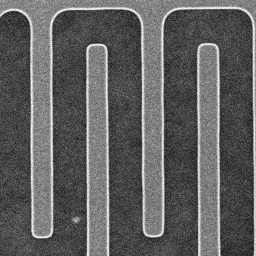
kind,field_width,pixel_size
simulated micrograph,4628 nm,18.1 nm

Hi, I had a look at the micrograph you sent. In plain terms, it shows groups of lines, slits or small figures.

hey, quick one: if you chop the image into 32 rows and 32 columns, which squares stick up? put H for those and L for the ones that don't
HHHHHHHHHHHHHHHHHHHHHHHHHHHHHHHH
HLHHHHHHLLLLLLLLLHHHHLLLLLLLLLLH
LLLLHHHLLLLLLLLLLHHHHLLLLLLLLLLH
LLLLHHLLLLLLLLLLLLHHLLLLLLLLLLLL
LLLLHHLLLLLLLLLLLLHHLLLLLLLLLLLL
LLLLHHLLLLLLLLLLLLHHLLLLLLLLLLLL
LLLLHHLLLLLHHLLLLLHHLLLLLHHLLLLL
LLLLHHLLLLLHHLLLLLHHLLLLLHHLLLLL
LLLLHHLLLLLHHLLLLLHHLLLLLHHLLLLL
LLLLHHLLLLLHHLLLLLHHLLLLLHHLLLLL
LLLLHHLLLLLHHLLLLLHHLLLLLHHLLLLL
LLLLHHLLLLLHHLLLLLHHLLLLLHHLLLLL
LLLLHHLLLLLHHLLLLLHHLLLLLHHLLLLL
LLLLHHLLLLLHHLLLLLHHLLLLLHHLLLLL
LLLLHHLLLLLHHLLLLLHHLLLLLHHLLLLL
LLLLHHLLLLLHHLLLLLHHLLLLLHHLLLLL
LLLLHHLLLLLHHLLLLLHHLLLLLHHLLLLL
LLLLHHLLLLLHHLLLLLHHLLLLLHHLLLLL
LLLLHHHLLLLHHLLLLLHHLLLLLHHLLLLL
LLLLHHHLLLLHHLLLLLHHLLLLLHHLLLLL
LLLLHHHLLLLHHLLLLLHHLLLLLHHLLLLL
LLLLHHHLLLLHHLLLLLHHLLLLLHHLLLLL
LLLLHHHLLLLHHLLLLLHHLLLLLHHLLLLL
LLLLHHHLLLLHHLLLLLHHLLLLLHHLLLLL
LLLLHHHLLLLHHHLLLLHHLLLLLHHLLLLL
LLLLHHHLLLLHHHLLLLHHLLLLLHHLLLLL
LLLLHHHLLLLHHHLLLLHHLLLLLHHLLLLL
LLLLHHHLLLLHHHLLLLHHLLLLLHHLLLLL
LLLLHHHLLLLHHHLLLLHHLLLLLHHLLLLL
LLLLHHLLLLLHHHLLLLLHLLLLLHHLLLLL
LLLLLLLLLLLHHHLLLLLLLLLLLHHLLLLL
LLLLLLLLLLLHHHLLLLLLLLLLLHHLLLLL